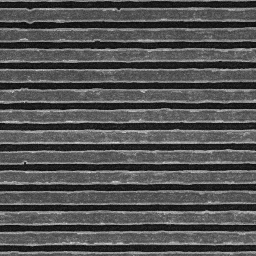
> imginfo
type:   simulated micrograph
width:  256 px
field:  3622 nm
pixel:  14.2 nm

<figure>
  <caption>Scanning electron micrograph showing parallel lines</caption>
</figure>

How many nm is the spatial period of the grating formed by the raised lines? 288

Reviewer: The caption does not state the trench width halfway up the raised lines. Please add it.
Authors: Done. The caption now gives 113 nm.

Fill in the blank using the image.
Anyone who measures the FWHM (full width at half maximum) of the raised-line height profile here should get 0.17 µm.